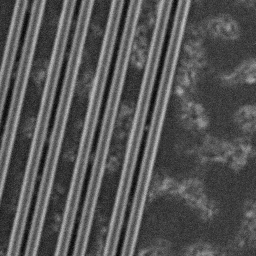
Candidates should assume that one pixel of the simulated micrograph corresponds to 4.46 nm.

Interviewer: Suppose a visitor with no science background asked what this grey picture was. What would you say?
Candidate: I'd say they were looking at parallel lines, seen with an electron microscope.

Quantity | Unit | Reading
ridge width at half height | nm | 45.1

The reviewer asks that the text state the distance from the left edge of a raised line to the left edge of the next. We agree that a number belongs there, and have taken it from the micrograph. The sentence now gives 102 nm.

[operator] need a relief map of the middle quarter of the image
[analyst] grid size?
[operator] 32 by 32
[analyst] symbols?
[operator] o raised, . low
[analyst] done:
.ooo.....oo..ooo.....oo..ooo....
.oo.....ooo..oo......oo..ooo....
.oo.....ooo..oo.....ooo..oo.....
ooo.....ooo.ooo.....ooo.ooo.....
ooo.....oo..ooo.....oo..ooo.....
oo.....ooo..oo......oo..ooo.....
oo.....ooo..oo.....ooo..oo......
oo.....ooo.ooo.....ooo.ooo......
oo.....oo..ooo.....ooo.ooo......
o......oo..ooo.....oo..ooo......
o.....ooo..oo......oo..ooo......
o.....ooo..oo.....ooo..oo.......
o.....ooo.ooo.....ooo.ooo.......
o.....oo..ooo.....oo..ooo.......
.....ooo..oo......oo..ooo.......
.....ooo..oo.....ooo..oo........
.....ooo.ooo.....ooo.ooo........
.....oo..ooo.....oo..ooo........
....ooo..oo......oo..ooo........
....ooo..oo......oo..ooo........
....ooo.ooo.....ooo..oo.........
....ooo.ooo.....ooo.ooo.........
....oo..ooo.....oo..ooo.........
...ooo..oo.....ooo..ooo.........
...ooo..oo.....ooo..oo..........
...ooo.ooo.....ooo.ooo..........
...oo..ooo.....oo..ooo..........
..ooo..oo......oo..ooo..........
..ooo..oo.....ooo..oo...........
..ooo.ooo.....ooo.ooo...........
..ooo.ooo.....ooo.ooo...........
..oo..ooo.....oo..ooo...........